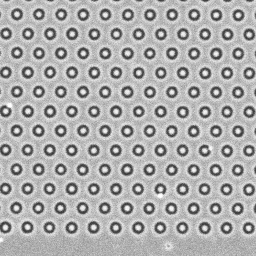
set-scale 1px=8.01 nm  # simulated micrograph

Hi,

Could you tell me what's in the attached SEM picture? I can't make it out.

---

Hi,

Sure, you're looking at a regular array of ring-shaped grooves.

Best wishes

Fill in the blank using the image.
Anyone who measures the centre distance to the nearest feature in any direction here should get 175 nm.